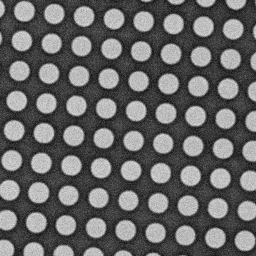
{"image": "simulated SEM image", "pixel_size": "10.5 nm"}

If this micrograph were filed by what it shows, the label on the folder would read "an array of small figures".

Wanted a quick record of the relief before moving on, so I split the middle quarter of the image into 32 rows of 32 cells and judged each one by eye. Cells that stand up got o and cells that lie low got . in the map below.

................................
..oooo....oo....................
.ooooo...oooo....ooo............
.ooooo...ooooo..ooooo...oooo....
..oooo...oooo...ooooo...ooooo..o
..........ooo....oooo...oooo...o
..................oo....oooo...o
................................
..oo............................
.oooo....ooo.....oo.............
.oooo...ooooo...oooo....ooo.....
.oooo...ooooo...oooo...ooooo...o
..oo.....oooo...oooo...ooooo...o
................oooo...ooooo...o
........................ooo....o
................................
oooo.....oo.....................
ooooo...oooo....ooo.............
ooooo...oooo...ooooo...oooo....o
.ooo....oooo...ooooo...oooo...oo
........ooo....oooo....oooo...oo
.................o.....oooo...oo
...............................o
ooo.............................
oooo...oooo.....oo..............
oooo...ooooo...oooo....ooo......
oooo...ooooo..ooooo...oooo....oo
.oo....oooo....oooo...oooo...ooo
...............ooo....oooo...ooo
.......................oo.....oo
................................
ooo....ooo......................